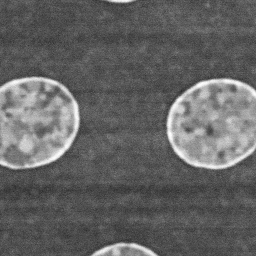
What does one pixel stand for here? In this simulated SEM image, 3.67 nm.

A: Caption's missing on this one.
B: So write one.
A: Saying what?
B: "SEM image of raised bodies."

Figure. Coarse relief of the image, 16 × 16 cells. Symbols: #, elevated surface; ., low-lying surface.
................
................
................
................
................
####........####
#####......#####
#####......#####
#####......#####
####.......#####
................
................
................
................
................
.......##.......